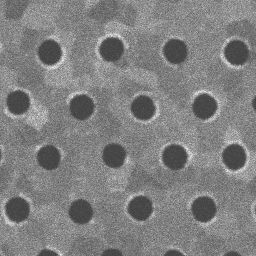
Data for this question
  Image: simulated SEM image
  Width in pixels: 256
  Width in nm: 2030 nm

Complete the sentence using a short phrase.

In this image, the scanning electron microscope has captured a regular array of holes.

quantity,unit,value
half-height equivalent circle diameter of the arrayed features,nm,198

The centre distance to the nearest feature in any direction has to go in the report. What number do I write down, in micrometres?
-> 0.469